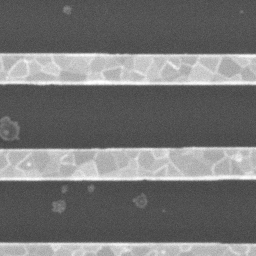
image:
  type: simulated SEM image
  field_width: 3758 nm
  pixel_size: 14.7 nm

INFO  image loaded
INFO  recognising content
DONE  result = lines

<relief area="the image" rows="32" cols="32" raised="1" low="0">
00000000000000000000000000000000
00000000000000000000000000000000
00000000000000000000000000000000
00000000000000000000000000000000
00000000000000000000000000000000
00000000000000000000000000000000
00000000000000000000000000000000
11111111111111111111111111111111
11111111111111111111111111111111
11111111111111111111111111111111
00000000111000111111111111111111
00000000000000000000000000000000
00000000000000000000000000000000
00000000000000000000000000000000
00000000000000000000000000000000
00000000000000000000000000000000
00000000000000000000000000000000
00000000000000000000000000000000
00000000000000000000000000000000
11111111111111111111111111111111
11111111111111111111111111111111
11111111111111111111111111111111
00000000000000000000000000000000
00000000000000000000000000000000
00000000000000000000000000000000
00000000000000000000000000000000
00000000000000000000000000000000
00000000000000000000000000000000
00000000000000000000000000000000
00000000000000000000000000000000
11111111111111110111111010100000
11111111111111111111111111111111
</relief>